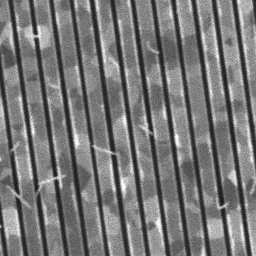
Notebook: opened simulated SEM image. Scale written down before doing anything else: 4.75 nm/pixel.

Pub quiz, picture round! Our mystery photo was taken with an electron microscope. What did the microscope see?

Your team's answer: parallel lines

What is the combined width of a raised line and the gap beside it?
95.7 nanometers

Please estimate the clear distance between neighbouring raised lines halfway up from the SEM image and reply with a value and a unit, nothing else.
25.3 nanometres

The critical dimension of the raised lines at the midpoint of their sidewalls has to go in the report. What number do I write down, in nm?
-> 67.7